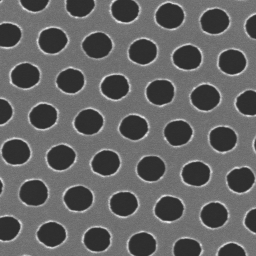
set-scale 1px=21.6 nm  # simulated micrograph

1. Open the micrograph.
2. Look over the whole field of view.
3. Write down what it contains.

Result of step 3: a regular array of holes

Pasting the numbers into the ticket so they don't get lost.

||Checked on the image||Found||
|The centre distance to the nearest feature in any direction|955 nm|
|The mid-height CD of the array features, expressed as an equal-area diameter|580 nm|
